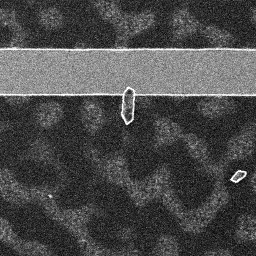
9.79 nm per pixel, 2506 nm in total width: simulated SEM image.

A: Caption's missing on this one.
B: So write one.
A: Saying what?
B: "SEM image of one or a few lines or trenches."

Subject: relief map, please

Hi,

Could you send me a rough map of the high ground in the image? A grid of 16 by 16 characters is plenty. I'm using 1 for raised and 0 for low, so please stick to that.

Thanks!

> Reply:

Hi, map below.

1111111111111111
1111111111111111
1111111111111111
0000000000000000
0000000000000000
0000000000000000
1111111111111111
1111111111111111
1111111111111111
1111111111111111
1111111111111111
1111111111111111
1111111111111111
1111111111111111
1111111111111111
1111111111111111